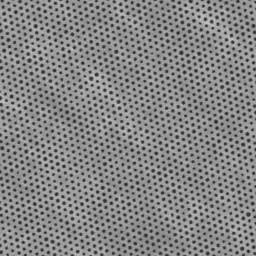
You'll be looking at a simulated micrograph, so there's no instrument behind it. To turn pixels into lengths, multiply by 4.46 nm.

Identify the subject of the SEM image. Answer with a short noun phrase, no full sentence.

a regular array of holes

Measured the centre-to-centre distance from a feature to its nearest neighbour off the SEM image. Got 28.6 nanometres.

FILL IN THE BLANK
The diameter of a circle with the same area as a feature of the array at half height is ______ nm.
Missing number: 14.2